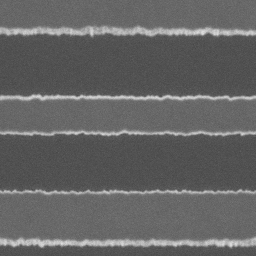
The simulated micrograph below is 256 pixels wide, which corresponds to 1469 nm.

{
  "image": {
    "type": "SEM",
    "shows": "lines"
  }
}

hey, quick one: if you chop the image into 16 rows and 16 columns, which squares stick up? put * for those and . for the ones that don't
****************
****************
................
................
................
................
****************
****************
................
................
................
................
****************
****************
****************
................